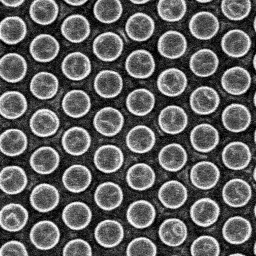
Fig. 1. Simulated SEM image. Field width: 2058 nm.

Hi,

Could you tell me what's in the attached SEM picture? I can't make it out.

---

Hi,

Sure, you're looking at a regular array of raised bodies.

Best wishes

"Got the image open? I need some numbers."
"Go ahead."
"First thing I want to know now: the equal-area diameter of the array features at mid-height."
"0.217 µm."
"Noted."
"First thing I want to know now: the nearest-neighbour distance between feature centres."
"0.294 µm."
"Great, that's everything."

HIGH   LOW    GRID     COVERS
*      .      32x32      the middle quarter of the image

******..........******..........
******..........******....**....
******...****....*****..******..
.****...******..........******..
........******..........******..
........******..........******..
........******.....*....******..
.****....****....*****...****...
******..........******..........
******..........******..........
******..........******..........
******...****...******...****...
.****...******....**....******..
........*******.........*******.
........*******.........******..
........******..........******..
.****...******...****....*****..
******....**....******..........
******..........******..........
******..........******..........
******.....*....******....***...
.****....*****...****....*****..
...*....******..........******..
........******..........******..
........******..........******..
..**....******...****....*****..
.*****....***...******....**....
******..........******..........
*******.........******..........
******..........******....**....
******...****....****....*****..
.****...******..........******..